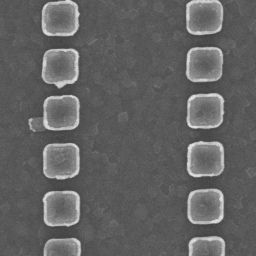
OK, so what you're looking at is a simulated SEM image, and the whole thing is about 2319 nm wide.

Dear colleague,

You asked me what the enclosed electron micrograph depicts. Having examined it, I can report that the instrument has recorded a regular array of raised bodies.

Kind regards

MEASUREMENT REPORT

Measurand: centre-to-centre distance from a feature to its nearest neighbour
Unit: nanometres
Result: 425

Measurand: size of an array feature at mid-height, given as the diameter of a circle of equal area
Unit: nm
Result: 347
